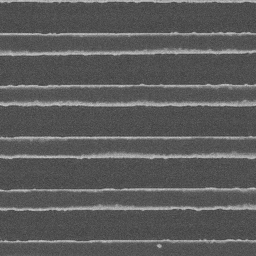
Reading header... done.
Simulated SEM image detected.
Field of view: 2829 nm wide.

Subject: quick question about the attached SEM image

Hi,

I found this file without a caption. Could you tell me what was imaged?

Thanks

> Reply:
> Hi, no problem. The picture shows lines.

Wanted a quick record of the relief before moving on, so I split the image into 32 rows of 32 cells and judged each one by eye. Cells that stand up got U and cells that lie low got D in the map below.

DDDDDDDDDDDDDDDDDDDDDDDDDDDDDDDD
DDDDDDDDDDDDDDDDDDDDDDDDDDDDDDDD
DDDDDDDDDDDDDDDDDDDDDDDDDDDDDDDD
DDDDDDDDDDDDDDDDDDDDDDDDDDDDDDDD
UUUUUUUUUUUUUUUUUUUUUUUUUUUUUUUU
UUUUUUUUUUUUUUUUUUUUUUUUUUUUUUUU
UUUUUUUUUUUUUUUUUUUUDDDDDDUUDDDD
DDDDDDDDDDDDDDDDDDDDDDDDDDDDDDDD
DDDDDDDDDDDDDDDDDDDDDDDDDDDDDDDD
DDDDDDDDDDDDDDDDDDDDDDDDDDDDDDDD
DDDDDDDDDDDDDDDDDDDDDDDDDDDDDDDD
UUUUUUUUUUUUUUUUUUUUUUUUUUUUUUUU
UUUUUUUUUUUUUUUUUUUUUUUUUUUUUUUU
DDDDDDDDDDDDDDDDDDDDDDDDDDDDDDDD
DDDDDDDDDDDDDDDDDDDDDDDDDDDDDDDD
DDDDDDDDDDDDDDDDDDDDDDDDDDDDDDDD
DDDDDDDDDDDDDDDDDDDDDDDDDDDDDDDD
UUUUUUUUUUUUUUUUUUUUUUUUUUUUUUUU
UUUUUUUUUUUUUUUUUUUUUUUUUUUUUUUU
UUUUUUUUUUUUUUDDUUUUUUUUUUUUUUUU
DDDDDDDDDDDDDDDDDDDDDDDDDDDDDDDD
DDDDDDDDDDDDDDDDDDDDDDDDDDDDDDDD
DDDDDDDDDDDDDDDDDDDDDDDDDDDDDDDD
DDDDDDDDDDDDDDDDDDDDDDDDDDDDDDDD
UUUUUUUUUUUUUUUUUUUUUUUUUUUUUUUU
UUUUUUUUUUUUUUUUUUUUUUUUUUUUUUUU
DDDDDDDDDDDDDDDDDDDDDDDDDDDDDDDD
DDDDDDDDDDDDDDDDDDDDDDDDDDDDDDDD
DDDDDDDDDDDDDDDDDDDDDDDDDDDDDDDD
DDDDDDDDDDDDDDDDDDDDDDDDDDDDDDDD
UUUUUUUUUUUUUUUUUUUUUUUUUUUUUUUU
UUUUUUUUUUUUUUUUUUUUUUUUUUUUUUUU